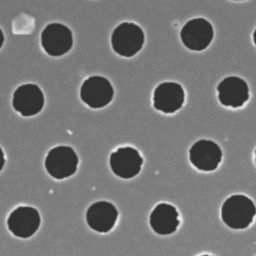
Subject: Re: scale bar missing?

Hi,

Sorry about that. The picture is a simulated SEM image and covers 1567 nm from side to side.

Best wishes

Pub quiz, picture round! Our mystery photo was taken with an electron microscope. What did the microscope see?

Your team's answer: a regular array of holes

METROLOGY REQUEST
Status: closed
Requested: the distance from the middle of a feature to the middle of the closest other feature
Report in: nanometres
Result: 396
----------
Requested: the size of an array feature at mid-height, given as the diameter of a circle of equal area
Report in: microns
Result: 0.196